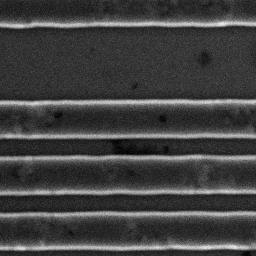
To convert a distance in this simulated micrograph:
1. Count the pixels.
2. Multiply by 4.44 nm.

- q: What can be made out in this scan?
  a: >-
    wiring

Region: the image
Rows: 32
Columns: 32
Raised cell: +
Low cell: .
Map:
++++++++++++++++++++++++++++++++
++++++++++++++++++++++++++++++++
++++++++++++++++++++++++++++++++
................................
................................
................................
................................
................................
................................
................................
................................
................................
................................
++++++++++++++++++++++++++++++++
++++++++++++++++++++++++++++++++
++++++++++++++++++++++++++++++++
++++++++++++++++++++++++++++++++
................................
................................
................................
++++++++++++++++++++++++++++++++
++++++++++++++++++++++++++++++++
++++++++++++++++++++++++++++++++
++++++++++++++++++++++++++++++++
................................
................................
................................
++++++++++++++++++++++++++++++++
++++++++++++++++++++++++++++++++
++++++++++++++++++++++++++++++++
++++++++++++++++++++++++++++++++
................................